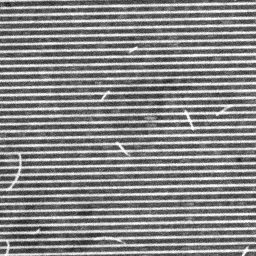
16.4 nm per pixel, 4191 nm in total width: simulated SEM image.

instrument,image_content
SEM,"parallel lines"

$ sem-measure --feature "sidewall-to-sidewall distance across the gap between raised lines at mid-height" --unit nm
98.2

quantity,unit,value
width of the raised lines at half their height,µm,0.0205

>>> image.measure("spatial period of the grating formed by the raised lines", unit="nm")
119